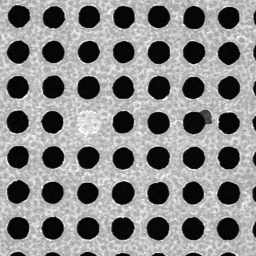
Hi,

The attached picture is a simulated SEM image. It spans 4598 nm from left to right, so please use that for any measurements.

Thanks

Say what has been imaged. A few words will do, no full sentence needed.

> a regular array of holes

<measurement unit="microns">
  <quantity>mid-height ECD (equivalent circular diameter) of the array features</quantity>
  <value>0.408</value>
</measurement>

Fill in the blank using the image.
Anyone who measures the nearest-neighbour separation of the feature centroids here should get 622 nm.